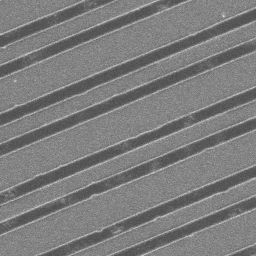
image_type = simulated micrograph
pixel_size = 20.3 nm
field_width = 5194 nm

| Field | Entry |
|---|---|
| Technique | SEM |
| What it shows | parallel lines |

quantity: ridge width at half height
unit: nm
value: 260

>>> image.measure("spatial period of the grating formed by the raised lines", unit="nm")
722